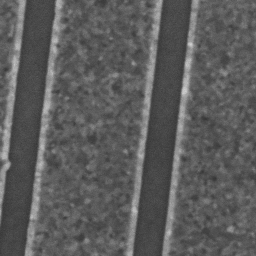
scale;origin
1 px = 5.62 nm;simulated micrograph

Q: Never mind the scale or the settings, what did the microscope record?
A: one or a few lines or trenches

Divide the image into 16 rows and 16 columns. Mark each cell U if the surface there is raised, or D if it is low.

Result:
UDDDUUUUUUDDUUUU
UDDDUUUUUUDDUUUU
UDDUUUUUUUDDUUUU
UDDUUUUUUUDDUUUU
UDDUUUUUUDDDUUUU
UDDUUUUUUDDDUUUU
UDDUUUUUUDDUUUUU
UDDUUUUUUDDUUUUU
DDDUUUUUUDDUUUUU
DDDUUUUUUDDUUUUU
DDUUUUUUUDDUUUUU
DDUUUUUUUDDUUUUU
DDUUUUUUDDDUUUUU
DDUUUUUUDDDUUUUU
DDUUUUUUDDDUUUUU
DDUUUUUUDDUUUUUU